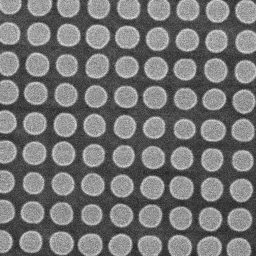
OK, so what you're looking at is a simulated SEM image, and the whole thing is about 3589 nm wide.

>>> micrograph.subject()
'an array of small figures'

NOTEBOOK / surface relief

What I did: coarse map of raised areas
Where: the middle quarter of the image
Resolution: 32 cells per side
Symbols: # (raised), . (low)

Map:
###...#####..#####..######..####
###...#####..#####..######..####
##....####....####...#####..####
......................###....###
................................
##.....##.......................
###...####...#####...####....###
###..#####...#####..######..####
###..######..#####..######..####
###...####...#####..#####...####
.......##.....###....####...####
................................
#...............................
###...####....###.....##........
###..#####...#####..#####...####
###..#####...#####..#####...####
###..#####...#####..#####...####
##....###....####...#####...####
...............#......#......##.
................................
##....###.......................
##...#####...####...####....###.
###..#####..#####...#####..#####
###..#####..#####...#####..#####
##...####....####...#####..#####
......##......##.....###...#####
................................
#...............................
##...####....###....####....###.
##...#####..#####...#####..#####
##..######..#####..######..#####
##...#####..#####..######..#####